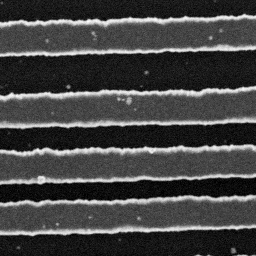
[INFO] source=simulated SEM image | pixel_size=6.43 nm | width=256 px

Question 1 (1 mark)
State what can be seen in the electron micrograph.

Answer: lines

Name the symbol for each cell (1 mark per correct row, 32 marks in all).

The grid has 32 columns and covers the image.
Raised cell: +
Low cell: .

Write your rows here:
................................
................................
..............++++++++++++++++++
++++++++++++++++++++++++++++++++
++++++++++++++++++++++++++++++++
++++++++++++++++++++++++++++++++
++++++++++++++++++++............
................................
................................
................................
................................
............+++++.++++++.+++++++
++++++++++++++++++++++++++++++++
++++++++++++++++++++++++++++++++
++++++++++++++++++++++++++++++++
+++++++++++++++++...............
................................
................................
..................+..+++++++++++
++++++++++++++++++++++++++++++++
++++++++++++++++++++++++++++++++
++++++++++++++++++++++++++++++++
+++++++++++++++++..+++..........
................................
.......................+.......+
++++++++++++++++++++++++++++++++
++++++++++++++++++++++++++++++++
++++++++++++++++++++++++++++++++
++++++++++++++++++++++++++++++..
................................
................................
................................